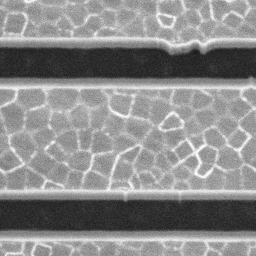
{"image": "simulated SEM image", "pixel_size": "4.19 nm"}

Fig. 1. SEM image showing one or a few lines or trenches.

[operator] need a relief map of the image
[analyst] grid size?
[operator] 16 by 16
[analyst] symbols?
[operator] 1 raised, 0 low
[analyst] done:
1111111111111111
1111111111111111
1111111111111111
0000000000000000
0000000000000000
1111111111111111
1111111111111111
1111111111111111
1111111111111111
1111111111111111
1111111111111111
1111111111111111
0000000000000000
0000000000000000
0000000000000000
1111111111111111